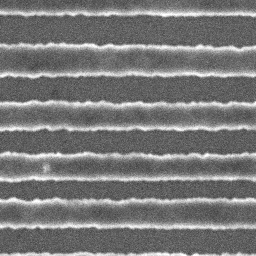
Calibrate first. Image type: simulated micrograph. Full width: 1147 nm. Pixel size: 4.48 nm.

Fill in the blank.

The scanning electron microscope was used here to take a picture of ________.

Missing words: lines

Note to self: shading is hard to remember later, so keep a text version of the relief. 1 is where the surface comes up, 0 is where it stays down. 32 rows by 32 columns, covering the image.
11111111111111111111111111111111
11111111111111111111111111111111
00000000000000000000000000000000
00000000000000000000000000000000
00000000000000000000000000000000
00000000000000000000000000000000
11111111111111111111111111111111
11111111111111111111111111111111
11111111111111111111111111111111
00011010000000000000000000001000
00000000000000000000000000000000
00000000000000000000000000000000
00000000000000000000000000000000
11111111111111111111111111111111
11111111111111111111111111111111
11111111111111111111111111111111
00000000000000000000000000000000
00000000000000000000000000000000
00000000000000000000000000000000
11111111111111111111111111111111
11111111111111111111111111111111
11111111111111111111111111111111
11100000001100011111000000000000
00000000000000000000000000000000
00000000000000000000000000000000
11111111111111111111111111111111
11111111111111111111111111111111
11111111111111111111111111111111
00000100000010000000111111111101
00000000000000000000000000000000
00000000000000000000000000000000
00000000000000000000000000000000